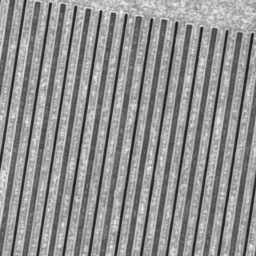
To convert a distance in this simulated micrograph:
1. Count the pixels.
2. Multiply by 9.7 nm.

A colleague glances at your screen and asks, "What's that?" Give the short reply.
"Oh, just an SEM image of parallel lines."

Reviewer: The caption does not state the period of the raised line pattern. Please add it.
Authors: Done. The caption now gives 124 nanometers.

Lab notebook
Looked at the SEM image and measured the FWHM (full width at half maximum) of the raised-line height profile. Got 76.6 nm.